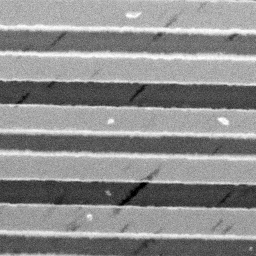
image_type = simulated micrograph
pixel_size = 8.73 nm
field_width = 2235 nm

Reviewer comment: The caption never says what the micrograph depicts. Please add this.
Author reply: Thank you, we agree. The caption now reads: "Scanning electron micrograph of lines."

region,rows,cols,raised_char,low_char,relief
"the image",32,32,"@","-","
@@@@@@@@@@@@@@@@@@@@@@@@@@@@@@@@
@@@@@@@@@@@@@@@@@@@@@@@@@@@@@@@@
@@@@@@@@@@@@@@@@@@@@@@@@@@@@@@@@
-------@@@@@@@@@@@@@@@@@@@@@@@@@
--------------------------------
--------------------------------
--------------------------------
@@@@@@@@@@@@@@@@@@@@@@@@@@@@@@@@
@@@@@@@@@@@@@@@@@@@@@@@@@@@@@@@@
@@@@@@@@@@@@@@@@@@@@@@@@@@@@@@@@
------------------------------@@
--------------------------------
--------------------------------
@@@@@@@@@@@@@@@@@@@@------------
@@@@@@@@@@@@@@@@@@@@@@@@@@@@@@@@
@@@@@@@@@@@@@@@@@@@@@@@@@@@@@@@@
----------@@@@@@@@@@@@@@@@@@@@@@
--------------------------------
--------------------------------
@@@@@@@@@@@@@@@@@@@@------------
@@@@@@@@@@@@@@@@@@@@@@@@@@@@@@@@
@@@@@@@@@@@@@@@@@@@@@@@@@@@@@@@@
--------@@@@@@@@@@@@@@@@@@@@@@@@
--------------------------------
--------------------------------
--------------------------------
@@@@@@@@@@@@@@@@@@@@@@@@@@@@@@@@
@@@@@@@@@@@@@@@@@@@@@@@@@@@@@@@@
@@@@@@@@@@@@@@@@@@@@@@@@@@@@@@@@
---------------------@-@-@@@@@@@
--------------------------------
--------------------------------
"